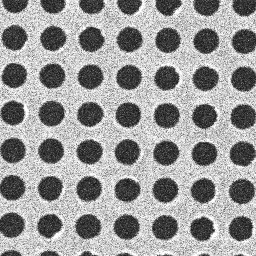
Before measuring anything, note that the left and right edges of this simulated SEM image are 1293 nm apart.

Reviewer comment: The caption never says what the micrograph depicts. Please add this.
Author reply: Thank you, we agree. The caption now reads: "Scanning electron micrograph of a regular array of holes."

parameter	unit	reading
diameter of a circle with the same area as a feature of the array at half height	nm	129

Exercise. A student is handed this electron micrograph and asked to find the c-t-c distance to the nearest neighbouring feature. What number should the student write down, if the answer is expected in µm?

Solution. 0.189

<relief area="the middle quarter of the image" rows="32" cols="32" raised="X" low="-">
XXXXX----XXXXXX---XXXXXXX-XXXXXX
XXXX-----XXXXX-----XXXX-----XXXX
XXXX------XXX------XXXX------XXX
XXX-------XXX-------XX-------XXX
XXXX------XXX------XXXX------XXX
XXXX-----XXXXX-----XXXX-----XXXX
XXXXXXXXXXXXXXXX-XXXXXXX---XXXXX
XXXXXXXXXXXXXXXXXXXXXXXXXXXXXXXX
XXXXXXXXXXXXXXXXXXXXXXXXXXXXXXXX
XXXXXX-XXXXXXXXX-XXXXXXXXXXXXXXX
XXXX-----XXXXX----XXXXXX----XXXX
XXX-------XXX------XXXX------XXX
XXX-------XXX------XXX-------XXX
XXX-------XXX------XXX-------XXX
XXXX-----XXXX------XXXX------XXX
XXXXX---XXXXXX----XXXXXX----XXXX
XXXXXXXXXXXXXXXXXXXXXXXXXXXXXXXX
XXXXXXXXXXXXXXXXXXXXXXXXXXXXXXXX
XXXXXXXXXXXXXXXXXXXXXXXXXXXXXXXX
XXXX----XXXXXX----XXXXXX---XXXXX
XXX------XXXX------XXXX-----XXXX
XXX-------XXX------XXX-------XXX
XXX-------XXX------XXX-------XXX
XXX------XXXX------XXX-------XXX
XXXXX---XXXXXX----XXXXX-----XXXX
XXXXXXXXXXXXXXXXXXXXXXXXXXXXXXXX
XXXXXXXXXXXXXXXXXXXXXXXXXXXXXXXX
XXXXXXXXXXXXXXXXXXXXXXXXXXXXXXXX
XXXXX---XXXXXXX-XXXXXXXX--XXXXXX
XXXX-----XXXX-----XXXXX-----XXXX
XXX------XXXX------XXX------XXXX
XXX------XXX-------XXX-------XXX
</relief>